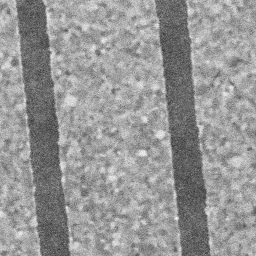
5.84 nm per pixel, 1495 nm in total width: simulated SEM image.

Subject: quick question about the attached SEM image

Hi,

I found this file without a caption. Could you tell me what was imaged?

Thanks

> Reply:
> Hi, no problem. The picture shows one or a few lines or trenches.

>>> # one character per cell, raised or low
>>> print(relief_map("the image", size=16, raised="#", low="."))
#..#######..####
#..#######..####
#..#######..####
#..#######..####
#..#######..####
#..#######..####
##.#######..####
##..######..####
##..#######.####
##..#######..###
##..#######..###
##..#######..###
##..#######..###
##..#######..###
##..#######..###
##..#######..###